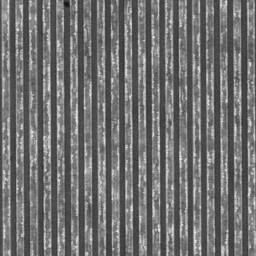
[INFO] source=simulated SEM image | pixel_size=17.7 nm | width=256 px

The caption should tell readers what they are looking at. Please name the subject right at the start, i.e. parallel lines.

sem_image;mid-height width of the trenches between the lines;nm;117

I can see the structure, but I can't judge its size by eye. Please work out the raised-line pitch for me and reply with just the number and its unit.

241 nm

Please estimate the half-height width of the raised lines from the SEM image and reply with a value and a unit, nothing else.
117 nanometres